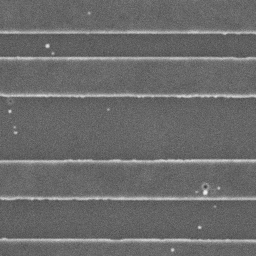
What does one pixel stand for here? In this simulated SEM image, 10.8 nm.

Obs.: lines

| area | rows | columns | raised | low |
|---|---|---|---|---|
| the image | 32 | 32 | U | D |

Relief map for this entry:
UUUUUUUUUUUUUUUUUUUUUUUUUUUUUUUU
UUUUUUUUUUUUUUUUUUUUUUUUUUUUUUUU
UUUUUUUUUUUUUUUUUUUUUUUUUUUUUUUU
UUUUUUUUUUUUUUUUUUUUUUUUUUUUUUUU
DDDDDDDDDDDDDDDDDDDDDDDDDDDDDDDD
DDDDDDDDDDDDDDDDDDDDDDDDDDDDDDDD
DDDDDDDDDDDDDDDDDDDDDDDDDDDDDDDD
UUUUUUUUUUUUUUUUUUUUUUUUUUUUUUUU
UUUUUUUUUUUUUUUUUUUUUUUUUUUUUUUU
UUUUUUUUUUUUUUUUUUUUUUUUUUUUUUUU
UUUUUUUUUUUUUUUUUUUUUUUUUUUUUUUU
UUUUUUUUUUUUUUUUUUUUUUUUUUUUUUUU
DDDDDDDDDDDDDDDDDDDDDDDDDDDDDDDD
DDDDDDDDDDDDDDDDDDDDDDDDDDDDDDDD
DDDDDDDDDDDDDDDDDDDDDDDDDDDDDDDD
DDDDDDDDDDDDDDDDDDDDDDDDDDDDDDDD
DDDDDDDDDDDDDDDDDDDDDDDDDDDDDDDD
DDDDDDDDDDDDDDDDDDDDDDDDDDDDDDDD
DDDDDDDDDDDDDDDDDDDDDDDDDDDDDDDD
DDDDDDDDDDDDDDDDDDDDDDDDDDDDDDDD
UUUUUUUUUUUUUUUUUUUUUUUUUUUUUUUU
UUUUUUUUUUUUUUUUUUUUUUUUUUUUUUUU
UUUUUUUUUUUUUUUUUUUUUUUUUUUUUUUU
UUUUUUUUUUUUUUUUUUUUUUUUUUUUUUUU
UUUUUUUUUUUUUUUUUUUUUUUUUUUUUUUU
DDDDDDDDDDDDDDDDDDDDDDDDDDDDDDDD
DDDDDDDDDDDDDDDDDDDDDDDDDDDDDDDD
DDDDDDDDDDDDDDDDDDDDDDDDDDDDDDDD
DDDDDDDDDDDDDDDDDDDDDDDDDDDDDDDD
DDDDDDDDDDDDDDDDDDDDDDDDDDDDDDDD
UUUUUUUUUUUUUUUUUUUUUUUUUUUUUUUU
UUUUUUUUUUUUUUUUUUUUUUUUUUUUUUUU